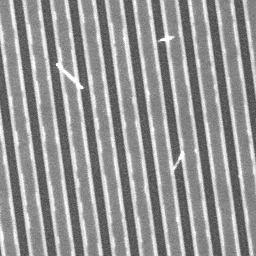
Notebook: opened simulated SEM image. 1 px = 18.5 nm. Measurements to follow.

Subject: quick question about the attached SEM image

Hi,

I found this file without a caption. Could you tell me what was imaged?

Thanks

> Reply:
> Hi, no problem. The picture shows parallel lines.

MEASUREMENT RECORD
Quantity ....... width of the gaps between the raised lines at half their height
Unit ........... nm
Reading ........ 220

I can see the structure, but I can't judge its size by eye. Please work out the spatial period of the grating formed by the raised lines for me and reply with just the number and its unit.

504 nm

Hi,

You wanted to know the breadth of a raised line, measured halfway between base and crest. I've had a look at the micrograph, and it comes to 0.284 um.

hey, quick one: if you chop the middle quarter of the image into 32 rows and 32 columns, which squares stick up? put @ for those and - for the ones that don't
@@@---@@@@---@@@@---@@@----@@@--
@@@---@@@@---@@@@---@@@@---@@@@-
@@@---@@@@---@@@@---@@@@---@@@@-
@@@---@@@@---@@@@---@@@@---@@@@-
@@@----@@@---@@@@---@@@@---@@@@-
@@@@---@@@----@@@---@@@@---@@@@-
@@@@---@@@@---@@@----@@@---@@@@-
@@@@---@@@@---@@@@---@@@----@@@-
@@@@---@@@@---@@@@---@@@@---@@@-
@@@@---@@@@---@@@@---@@@@---@@@@
@@@@---@@@@---@@@@---@@@@---@@@@
-@@@---@@@@---@@@@---@@@@---@@@@
-@@@----@@@---@@@@---@@@@---@@@@
-@@@@---@@@----@@@----@@@---@@@@
-@@@@---@@@@---@@@----@@@----@@@
-@@@@---@@@@---@@@@---@@@@---@@@
-@@@@---@@@@---@@@@---@@@@---@@@
-@@@@---@@@@---@@@@---@@@@---@@@
--@@@---@@@@---@@@@---@@@@---@@@
--@@@----@@@---@@@@---@@@@---@@@
--@@@@---@@@----@@@---@@@@---@@@
--@@@@---@@@@---@@@----@@@----@@
--@@@@---@@@@---@@@@---@@@---@@@
--@@@@---@@@@---@@@@---@@@@---@@
--@@@@---@@@@---@@@@---@@@@---@@
--@@@@---@@@@---@@@@---@@@@---@@
---@@@----@@@---@@@@---@@@@---@@
---@@@----@@@----@@@---@@@@---@@
---@@@@---@@@@---@@@----@@@---@@
---@@@@---@@@@---@@@@---@@@----@
---@@@@---@@@@---@@@@---@@@@---@
---@@@@---@@@@---@@@@---@@@@---@